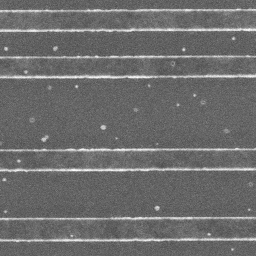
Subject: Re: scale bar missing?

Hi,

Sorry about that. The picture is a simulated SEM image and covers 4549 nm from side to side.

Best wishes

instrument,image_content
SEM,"lines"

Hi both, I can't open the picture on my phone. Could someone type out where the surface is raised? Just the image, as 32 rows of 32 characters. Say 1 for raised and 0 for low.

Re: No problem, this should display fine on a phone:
00000000000000000000000000000000
11111111111111111111111111111111
11111111111111111111111111111111
11111111111111111111111111111111
00000000000000000000000000000000
00000000000000000000000000000000
00000000000000000000000000000000
11111111111111111111111111111111
11111111111111111111111111111111
11111111111111111111111111111110
00000000000000000000000000000000
00000000000000000000000000000000
00000000000000000000000000000000
00000000000000000000000000000000
00000000000000000000000000000000
00000000000000000000000000000000
00000000000000000000000000000000
00000000000000000000000000000000
00000000000000000000000000000000
11111111111111111111111111111111
11111111111111111111111111111111
00000000000000000000000000000000
00000000000000000000000000000000
00000000000000000000000000000000
00000000000000000000000000000000
00000000000000000000000000000000
00000000000000000000000000000000
11111111111111111111111111111111
11111111111111111111111111111111
11111111111111111111111111111111
00000000000000000000000000000000
00000000000000000000000000000000